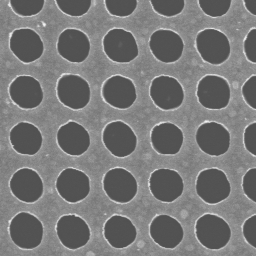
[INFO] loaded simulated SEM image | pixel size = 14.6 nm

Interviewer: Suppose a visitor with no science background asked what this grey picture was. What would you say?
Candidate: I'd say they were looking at a regular array of holes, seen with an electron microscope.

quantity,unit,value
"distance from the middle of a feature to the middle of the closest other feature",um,0.674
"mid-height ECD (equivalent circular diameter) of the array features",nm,486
